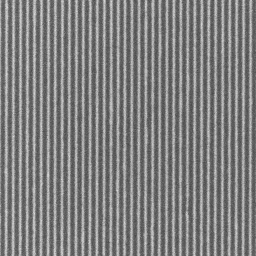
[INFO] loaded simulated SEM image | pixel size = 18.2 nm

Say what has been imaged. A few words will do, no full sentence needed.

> parallel lines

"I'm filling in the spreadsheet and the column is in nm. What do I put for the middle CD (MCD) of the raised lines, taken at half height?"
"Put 27.3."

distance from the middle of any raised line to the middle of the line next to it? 6.97 pixels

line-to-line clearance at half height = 97.8 nm